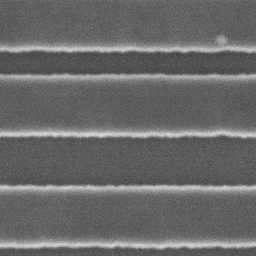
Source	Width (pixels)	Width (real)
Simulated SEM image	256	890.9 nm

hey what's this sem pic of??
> lines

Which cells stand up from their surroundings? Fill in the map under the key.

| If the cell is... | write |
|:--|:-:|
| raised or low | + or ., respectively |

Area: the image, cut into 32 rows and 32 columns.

++++++++++++++++++++++++++++++++
++++++++++++++++++++++++++++++++
++++++++++++++++++++++++++++++++
++++++++++++++++++++++++++++++++
++++++++++++++++++++++++++++++++
++++++++++++++++++++++++++++++++
................................
................................
................................
++++++++++++++++++++++++++++++++
++++++++++++++++++++++++++++++++
++++++++++++++++++++++++++++++++
++++++++++++++++++++++++++++++++
++++++++++++++++++++++++++++++++
++++++++++++++++++++++++++++++++
++++++++++++++++++++++++++++++++
++++++++++++++++++++++++++++++++
................................
................................
................................
................................
................................
................................
++++++++++++++++++++++++++++++++
++++++++++++++++++++++++++++++++
++++++++++++++++++++++++++++++++
++++++++++++++++++++++++++++++++
++++++++++++++++++++++++++++++++
++++++++++++++++++++++++++++++++
++++++++++++++++++++++++++++++++
++++++++++++++++++++++++++++++++
................................